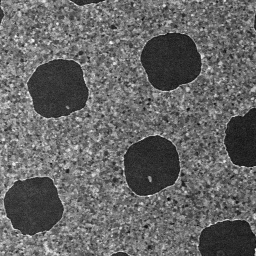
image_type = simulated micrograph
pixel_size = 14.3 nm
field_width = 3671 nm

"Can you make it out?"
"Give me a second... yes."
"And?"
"holes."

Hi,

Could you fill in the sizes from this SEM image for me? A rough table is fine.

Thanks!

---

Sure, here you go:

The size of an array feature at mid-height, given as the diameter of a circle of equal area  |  849 nanometers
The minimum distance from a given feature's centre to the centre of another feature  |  1.6 micrometres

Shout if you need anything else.